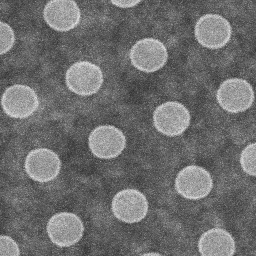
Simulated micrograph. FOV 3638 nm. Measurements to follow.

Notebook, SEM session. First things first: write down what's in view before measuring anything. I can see a regular array of raised bodies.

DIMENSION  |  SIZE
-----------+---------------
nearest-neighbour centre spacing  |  67.8 pixels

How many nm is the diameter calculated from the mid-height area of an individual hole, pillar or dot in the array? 486